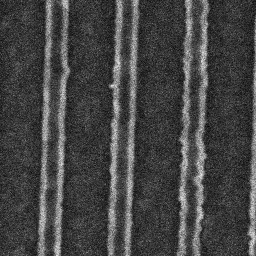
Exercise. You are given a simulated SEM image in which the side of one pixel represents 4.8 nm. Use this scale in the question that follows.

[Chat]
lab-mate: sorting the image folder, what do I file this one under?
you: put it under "one or a few lines or trenches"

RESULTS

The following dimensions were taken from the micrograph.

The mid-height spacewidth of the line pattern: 255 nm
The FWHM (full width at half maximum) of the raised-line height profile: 17.1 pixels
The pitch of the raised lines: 335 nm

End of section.